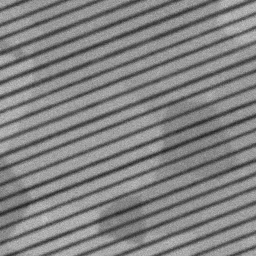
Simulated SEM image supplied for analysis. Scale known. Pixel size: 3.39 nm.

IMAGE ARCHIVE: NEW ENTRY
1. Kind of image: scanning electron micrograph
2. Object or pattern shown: parallel lines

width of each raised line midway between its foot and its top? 10.2 pixels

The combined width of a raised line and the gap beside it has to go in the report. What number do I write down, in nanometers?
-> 46.1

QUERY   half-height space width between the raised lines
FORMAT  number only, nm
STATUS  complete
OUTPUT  12.6